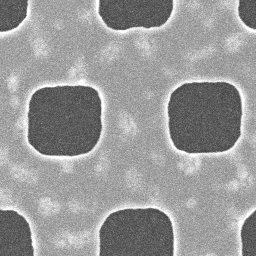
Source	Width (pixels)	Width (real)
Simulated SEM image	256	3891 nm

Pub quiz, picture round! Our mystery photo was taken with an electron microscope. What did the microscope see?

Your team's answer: holes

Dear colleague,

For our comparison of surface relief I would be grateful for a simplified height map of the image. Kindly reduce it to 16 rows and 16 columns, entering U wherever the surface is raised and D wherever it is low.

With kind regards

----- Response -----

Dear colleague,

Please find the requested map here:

DDUUUUDDDDDUUUUD
DUUUUUUDDDUUUUUD
UUUUUUUUUUUUUUUU
UUUUUUUUUUUUUUUU
UUUUUUUUUUUUUUUU
UUUDDDUUUUUDDDDU
UUDDDDUUUUDDDDDU
UUDDDDUUUUUDDDDU
UUDDDDUUUUUDDDDU
UUDDDUUUUUUUDDUU
UUUUUUUUUUUUUUUU
UUUUUUUUUUUUUUUU
UUUUUUUUUUUUUUUU
DUUUUUUDDDUUUUUU
DDUUUUDDDDDUUUUD
DDUUUUDDDDDUUUUD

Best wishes